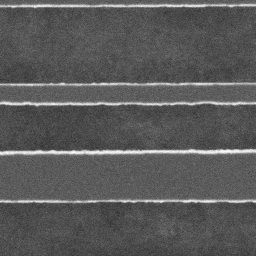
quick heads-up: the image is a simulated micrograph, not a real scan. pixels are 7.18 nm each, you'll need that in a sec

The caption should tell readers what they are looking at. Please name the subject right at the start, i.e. lines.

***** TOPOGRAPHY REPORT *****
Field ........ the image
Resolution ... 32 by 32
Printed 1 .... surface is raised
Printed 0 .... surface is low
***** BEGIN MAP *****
11111111111111111111111111111111
00000000000000000000000000000000
00000000000000000000000000000000
00000000000000000000000000000000
00000000000000000000000000000000
00000000000000000000000000000000
00000000000000000000000000000000
00000000000000000000000000000000
00000000000000000000000000000000
00000000000000000000000000000000
00000011000111111011111111111111
11111111111111111111111111111111
11111111111111111111111111111111
00000000000000000000000000000000
00000000000000000000000000000000
00000000000000000000000000000000
00000000000000000000000000000000
00000000000000000000000000000000
00000000000000000000000000000000
11111111111111111111111111111111
11111111111111111111111111111111
11111111111111111111111111111111
11111111111111111111111111111111
11111111111111111111111111111111
11111111111111111111111111111111
00000000000000000000000000000000
00000000000000000000000000000000
00000000000000000000000000000000
00000000000000000000000000000000
00000000000000000000000000000000
00000000000000000000000000000000
00000000000000000000000000000000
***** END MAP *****